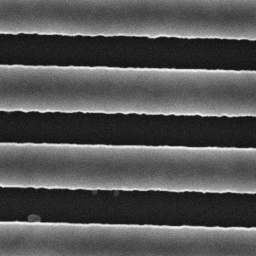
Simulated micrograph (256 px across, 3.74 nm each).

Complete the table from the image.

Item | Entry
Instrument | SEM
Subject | lines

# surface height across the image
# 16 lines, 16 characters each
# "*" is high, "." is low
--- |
****************
****************
................
................
****************
****************
****************
................
................
****************
****************
****************
................
................
****************
****************